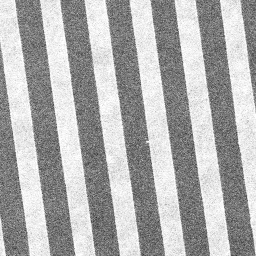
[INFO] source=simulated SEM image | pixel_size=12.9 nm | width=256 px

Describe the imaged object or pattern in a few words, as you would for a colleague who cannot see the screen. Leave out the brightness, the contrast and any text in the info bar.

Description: parallel lines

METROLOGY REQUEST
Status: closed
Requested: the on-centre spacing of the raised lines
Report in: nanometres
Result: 573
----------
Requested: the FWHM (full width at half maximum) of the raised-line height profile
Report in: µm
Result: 0.253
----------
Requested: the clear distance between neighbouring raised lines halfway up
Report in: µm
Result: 0.322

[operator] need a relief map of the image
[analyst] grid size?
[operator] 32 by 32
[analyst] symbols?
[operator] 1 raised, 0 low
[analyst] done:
11000111000110001110001100001100
11000111000110001110001110001100
11000111000110000110001110001100
11000011000111000110001110001100
11000011000111000110000110001110
11100011000111000110000110001110
11100011000011000111000110001110
11100011000011000111000110000110
01100011100011000111000110000110
01100011100011000011000111000110
01100011100011100011000111000110
01100001100011100011000111000111
01110001100011100011000011000111
01110001100011100011100011000111
01110001100001100011100011000111
00110001110001100011100011100011
00110001110001100011100011100011
00110001110001110001100011100011
00110000110001110001100011100011
00111000110001110001100001100011
00111000110001110001110001100011
00111000110000110001110001100011
00011000111000110001110001100001
00011000111000110001110001110001
00011000111000111000110001110001
00011000011000111000110001110001
00011000011000111000110000110001
00011100011000111000111000110001
00011100011000011000111000110000
00011100011100011000111000110000
00001100011100011000111000111000
10001100011100011000011000111000